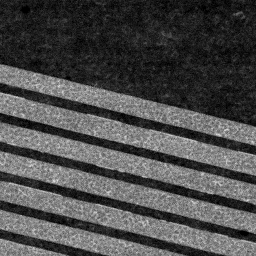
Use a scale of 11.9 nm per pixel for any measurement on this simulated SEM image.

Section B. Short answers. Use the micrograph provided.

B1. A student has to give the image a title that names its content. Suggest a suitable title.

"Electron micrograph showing parallel lines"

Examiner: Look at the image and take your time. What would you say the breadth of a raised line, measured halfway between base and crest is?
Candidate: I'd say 16.8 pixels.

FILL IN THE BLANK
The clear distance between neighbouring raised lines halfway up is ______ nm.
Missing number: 114